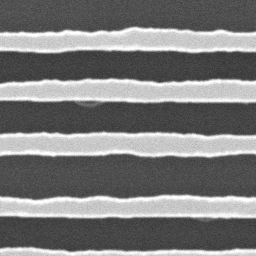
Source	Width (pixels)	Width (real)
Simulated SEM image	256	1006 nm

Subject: lines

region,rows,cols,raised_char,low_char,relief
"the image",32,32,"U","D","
DDDDDDDDDDDDDDDDDDDDDDDDDDDDDDDD
DDDDDDDDDDDDDDDDDDDDDDDDDDDDDDDD
DDDDDDDDDDDDDDDDDDDDDDDDDDDDDDDD
DDDDDDDDDDDDDDDDDDDDDDDDDDDDDDDD
UUUUUUUUUUUUUUUUUUUUUUUUUUUUUUUU
UUUUUUUUUUUUUUUUUUUUUUUUUUUUUUUU
DDDDDDDDDDDDDDDDDDDDDDDDDDDDDDDD
DDDDDDDDDDDDDDDDDDDDDDDDDDDDDDDD
DDDDDDDDDDDDDDDDDDDDDDDDDDDDDDDD
DDDDDDDDDDDDDDDDDDDDDDDDDDDDDDDD
DUUUUUUUUUUUUUUUUUUUUUUUUUUUUUUU
UUUUUUUUUUUUUUUUUUUUUUUUUUUUUUUU
DDDDUUUUDDDDUUUUUUUUUUUUUUUUUUUU
DDDDDDDDDDDDDDDDDDDDDDDDDDDDDDDD
DDDDDDDDDDDDDDDDDDDDDDDDDDDDDDDD
DDDDDDDDDDDDDDDDDDDDDDDDDDDDDDDD
DDDDDDDDDDDDDDDDDDDDDDDDDDDDDDDD
UUUUUUUUUUUUUUUUUUUUUUUUUUUUUUUU
UUUUUUUUUUUUUUUUUUUUUUUUUUUUUUUU
DDDDDDDDDDDDDDDDDDDDDDDDDDUDDDDD
DDDDDDDDDDDDDDDDDDDDDDDDDDDDDDDD
DDDDDDDDDDDDDDDDDDDDDDDDDDDDDDDD
DDDDDDDDDDDDDDDDDDDDDDDDDDDDDDDD
DDDDDDDDDDDDDDDDDDDDDDDDDDDDDDDD
DDDDDDDDDDDDDDDDDDDDDDDDDDDDDDDD
UUUUUUUUUUUUUUUUUUUUUUUUUUUUUUUU
UUUUUUUUUUUUUUUUUUUUUUUUUUUUUUUU
DDDDDDDDDDDDDDDDDDDDDDDDDDDDDDDD
DDDDDDDDDDDDDDDDDDDDDDDDDDDDDDDD
DDDDDDDDDDDDDDDDDDDDDDDDDDDDDDDD
DDDDDDDDDDDDDDDDDDDDDDDDDDDDDDDD
UUUUUUUUUDUUUUUDDDDUUUUUUUDDUUUU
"